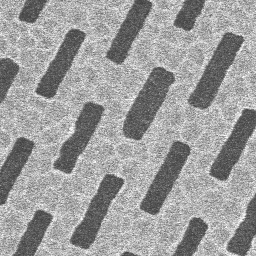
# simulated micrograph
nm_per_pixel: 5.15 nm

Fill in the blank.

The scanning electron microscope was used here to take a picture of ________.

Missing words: holes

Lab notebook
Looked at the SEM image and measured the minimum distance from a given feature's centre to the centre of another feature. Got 389 nm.